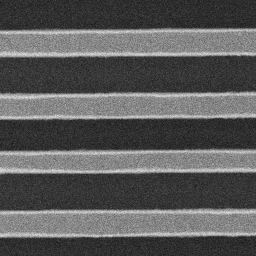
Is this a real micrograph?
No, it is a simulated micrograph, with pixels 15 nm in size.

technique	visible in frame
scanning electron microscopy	lines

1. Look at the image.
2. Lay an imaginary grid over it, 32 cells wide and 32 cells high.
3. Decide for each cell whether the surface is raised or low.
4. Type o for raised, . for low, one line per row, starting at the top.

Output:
................................
................................
................................
................................
oooooooooooooooooooooooooooooooo
oooooooooooooooooooooooooooooooo
oooooooooooooooooooooooooooooooo
................................
................................
................................
................................
................................
oooooooooooooooooooooooooooooooo
oooooooooooooooooooooooooooooooo
oooooooooooooooooooooooooooooooo
................................
................................
................................
................................
oooooooooooooooooooooooooooooooo
oooooooooooooooooooooooooooooooo
ooooooooooooooooooooooooooooo...
................................
................................
................................
................................
.ooooooooooooooooooooooooooooooo
oooooooooooooooooooooooooooooooo
oooooooooooooooooooooooooooooooo
oooooooooooooooooooooo..........
................................
................................